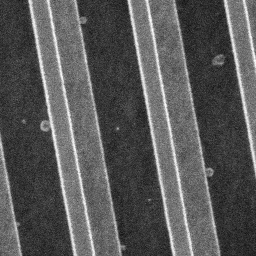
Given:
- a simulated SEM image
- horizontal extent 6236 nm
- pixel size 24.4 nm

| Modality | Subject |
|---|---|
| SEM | lines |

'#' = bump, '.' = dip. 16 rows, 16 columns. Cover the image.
..###...###...##
..###...###...##
..###...###...##
..###....##....#
...##....###...#
...###...###...#
...###...###...#
...###...###...#
...###...###....
....##....###...
....###...###...
#...###...###...
#...###...###...
#...###...###...
#...###....##...
#....##....###..